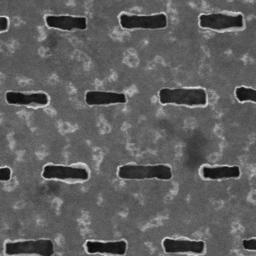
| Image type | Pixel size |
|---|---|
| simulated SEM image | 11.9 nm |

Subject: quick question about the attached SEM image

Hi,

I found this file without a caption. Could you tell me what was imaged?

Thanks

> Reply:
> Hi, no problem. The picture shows a regular array of holes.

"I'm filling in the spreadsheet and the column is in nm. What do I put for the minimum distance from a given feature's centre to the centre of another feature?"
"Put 921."